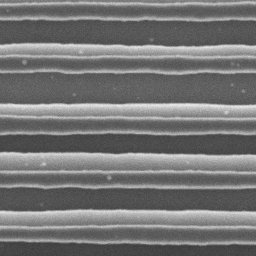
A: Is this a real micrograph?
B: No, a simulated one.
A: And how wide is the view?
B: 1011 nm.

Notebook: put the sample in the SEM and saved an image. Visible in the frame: lines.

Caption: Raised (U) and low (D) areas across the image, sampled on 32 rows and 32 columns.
UUUUUUUUUUUUUUUUUUUUUUUUUUUUUUUU
UUUUUUUUUUUUUUUUUUUUUUUUUUUUUUUU
DDDDDDDUUDDDDDDUUUDUUUUUUUUUUDDU
DDDDDDDDDDDDDDDDDDDDDDDDDDDDDDDD
DDDDDDDDDDDDDDDDDDDDDDDDDDDDDDDD
DDDDDDDDDDDDDDDDDDDDDDDDDDDDDDDD
UUUUUUUUUUUUUUUUUUUUUUUUUUUUUUUU
UUUUUUUUUUUUUUUUUUUUUUUUUUUUUUUU
UUUUUUUUUUUUUUUUUUUUUUUUUUUUUUUU
DDDDDDDDDDDDDDDDDDDDDDDDDDDDDDDD
DDDDDDDDDDDDDDDDDDDDDDDDDDDDDDDD
DDDDDDDDDDDDDDDDDDDDDDDDDDDDDDDD
DDDDDDDDDDDDDDDDDDDDDDDDDDDDDDDD
UUUUUUUUUUUUUUUUUUUUUUUUUUUUUUUU
UUUUUUUUUUUUUUUUUUUUUUUUUUUUUUUU
UUUUUUUUUUUUUUUUUUUUUUUUUUUUUUUU
UUUUUUUUUUUUUUUUUUUUUUUUUUUUUUUU
DDDDDDDDDDDDDDDDDDDDDDDDDDDDDDDD
DDDDDDDDDDDDDDDDDDDDDDDDDDDDDDDD
UUUUUUUUUUUUUUUUUUUUUUUUUUDDDUUU
UUUUUUUUUUUUUUUUUUUUUUUUUUUUUUUU
UUUUUUUUUUUUUUUUUUUUUUUUUUUUUUUU
UUUUUUUUUUUUUUUUUUUUUUUUUUUUUUUU
DDDDDDDDDDDUDDDDDDDDDDDDUDDDDUDD
DDDDDDDDDDDDDDDDDDDDDDDDDDDDDDDD
DDDDDDDDDDDDDDDDDDDDDDDDDDDDDDDD
UDDDDUUUUUUUUUUUUUUUUUUUUUUUDDDD
UUUUUUUUUUUUUUUUUUUUUUUUUUUUUUUU
UUUUUUUUUUUUUUUUUUUUUUUUUUUUUUUU
UUUUUUUUUUUUUUUUUUUUUUUUUUUUUUUU
DDDDDDDDDDDDDDDDDDDDUUUUUUDDUDDU
DDDDDDDDDDDDDDDDDDDDDDDDDDDDDDDD